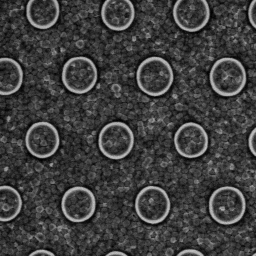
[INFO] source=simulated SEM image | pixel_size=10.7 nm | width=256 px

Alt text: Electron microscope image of a regular array of raised bodies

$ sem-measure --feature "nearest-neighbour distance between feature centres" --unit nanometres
789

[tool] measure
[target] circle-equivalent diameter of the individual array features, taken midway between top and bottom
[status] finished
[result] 365 nm